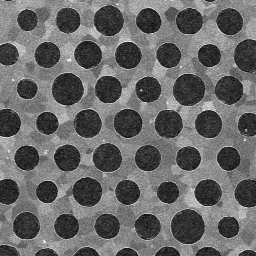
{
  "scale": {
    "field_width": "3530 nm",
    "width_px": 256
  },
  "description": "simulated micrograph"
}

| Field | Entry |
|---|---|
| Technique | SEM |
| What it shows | a regular array of holes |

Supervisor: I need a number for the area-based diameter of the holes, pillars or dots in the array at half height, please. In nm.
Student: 365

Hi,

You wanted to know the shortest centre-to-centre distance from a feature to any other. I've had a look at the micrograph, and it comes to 545 nm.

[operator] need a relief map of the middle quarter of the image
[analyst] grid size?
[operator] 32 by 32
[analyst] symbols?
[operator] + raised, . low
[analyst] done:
++++....++++++....++++++....++++
++++++++++++++++++++++++++++++++
..++++++++++++++++++++++++++++..
....+++++....+++++++.+.+++++....
.....+++......++++......++++....
.....+++.......+++......+++.+...
.....+++.......+++.+....++++....
.....+++......++++......+++.....
....++++......+++++.....++++....
....+++++....+++++++..++++++....
++++++++++++++++++++++++++++++..
+++++..+++++++....++++++++++++++
+++......++++......++++...+..+++
++++.....++++++++..++++......+++
++++......++.++++...+++.......++
+++.....+.++........+++.......++
+++......++++......++++......+++
+++......+++++.....++++......+++
+++++..++++++++..++++++++..+++++
++++++++++++++++++++++++++++++++
...++++++....+++++++...+++++++++
....++++......++++......+++++.++
....+++.......++++......++++..++
....+++........+++......++++...+
....+++........+++......++++...+
....++++......++++......++++....
...++++++....++++++....+++++++..
++++++++++++++++++++++++++++++++
+++++..+++++++++++++++++++++++++
+++......+++++....+++++++..+++++
++.......++++......+++++....++++
++........+++......++++......+++